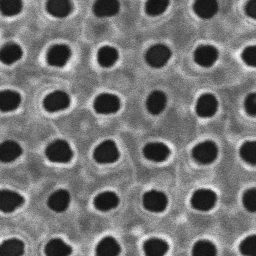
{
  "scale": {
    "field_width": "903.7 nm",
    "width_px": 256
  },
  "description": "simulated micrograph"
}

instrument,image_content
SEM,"a regular array of holes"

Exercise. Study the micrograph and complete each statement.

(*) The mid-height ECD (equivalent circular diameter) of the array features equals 85.9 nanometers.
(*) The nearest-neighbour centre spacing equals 166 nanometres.